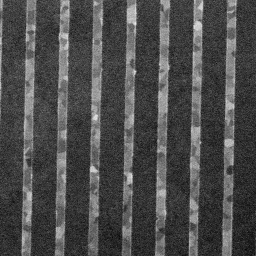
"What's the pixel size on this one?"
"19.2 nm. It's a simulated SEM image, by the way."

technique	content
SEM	parallel lines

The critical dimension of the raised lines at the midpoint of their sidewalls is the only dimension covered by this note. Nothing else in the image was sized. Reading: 158 nanometres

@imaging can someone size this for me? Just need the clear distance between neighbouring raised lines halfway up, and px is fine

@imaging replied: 25.4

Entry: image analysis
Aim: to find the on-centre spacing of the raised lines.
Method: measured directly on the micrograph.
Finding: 643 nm